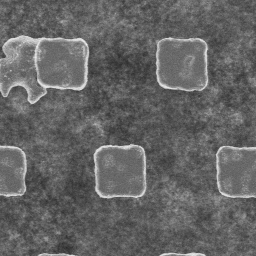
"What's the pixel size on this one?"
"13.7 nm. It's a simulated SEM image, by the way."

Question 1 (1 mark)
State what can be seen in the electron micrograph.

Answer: raised bodies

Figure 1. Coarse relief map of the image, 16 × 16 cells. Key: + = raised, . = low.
................
................
...++.....++....
..+++.....+++...
..+++.....+++...
....+.....+++...
................
................
................
+.....+++.....++
++....+++.....++
++....+++.....++
................
................
................
................